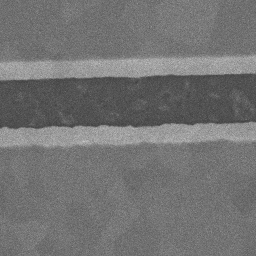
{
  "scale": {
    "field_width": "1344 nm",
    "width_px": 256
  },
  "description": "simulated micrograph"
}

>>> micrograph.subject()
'one or a few lines or trenches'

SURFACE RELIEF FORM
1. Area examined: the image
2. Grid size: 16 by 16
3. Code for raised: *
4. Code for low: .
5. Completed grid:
****************
****************
****************
****************
.*..............
................
................
................
**.*************
****************
****************
****************
****************
****************
****************
****************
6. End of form